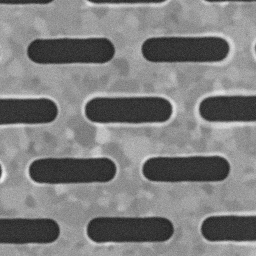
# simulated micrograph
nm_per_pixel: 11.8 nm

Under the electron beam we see groups of lines, slits or small figures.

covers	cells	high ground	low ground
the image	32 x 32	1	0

00000011111000000000111111111111
11111111111111111111111111111111
11111111111111111111111111111111
11111111111111111111111111111111
11111111111111111111000000001111
11110000000000111100000000000111
11100000000000111100000000000111
11110000000000111100000000001111
11111111111111111111111111111111
11111111111111111111111111111111
11111111111111111111111111111111
11111111111111111111111111111111
00000001111000000000011110000000
00000001110000000000001110000000
00000001111000000000001110000000
00000111111100000000111111000001
11111111111111111111111111111111
11111111111111111111111111111111
11111111111111111111111111111111
11111111111111111111010000001111
11110000000000011100000000000111
11100000000000011100000000000111
11110000000000111100000000001111
11111111111111111111111111111111
11111111111111111111111111111111
11111111111111111111111111111111
11111111111111111111111111111111
00000001111000000000011110000000
00000000111000000000001110000000
00000001111000000000001110000000
00000011111111111111111111111111
11111111111111111111111111111111